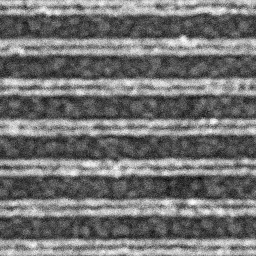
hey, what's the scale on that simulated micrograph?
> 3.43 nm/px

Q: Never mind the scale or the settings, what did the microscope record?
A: parallel lines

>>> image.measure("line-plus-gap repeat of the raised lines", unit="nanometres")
138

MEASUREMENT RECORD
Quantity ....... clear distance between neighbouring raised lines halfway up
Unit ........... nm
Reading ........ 92.6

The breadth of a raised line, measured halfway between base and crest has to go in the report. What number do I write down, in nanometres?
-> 44.6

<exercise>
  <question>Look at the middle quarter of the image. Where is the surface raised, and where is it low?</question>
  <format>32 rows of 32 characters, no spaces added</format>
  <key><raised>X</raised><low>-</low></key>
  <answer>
--------------------------------
--------------------------------
--------------------------------
--------------------------------
XXXXXXXXXXXXXXXXXXXXXXXXXXXXXXXX
XXXXXXXXXXXXXXXXXXXXXXXXXXXXXXXX
XXXXXXXXXXXXXXXXXXXXXXXXXXXXXXXX
--------------------------------
--------------------------------
--------------------------------
--------------------------------
--------------------------------
--------------------------------
--------------------------------
XXXXXXXXXXXXXXXXXXXXX---XXXXXXXX
XXXXXXXXXXXXXXXXXXXXXXXXXXXXXXXX
XXXXXXXXXXXXXXXXXXXXXXXXXXXXXXXX
--------------------------------
--------------------------------
--------------------------------
--------------------------------
--------------------------------
--------------------------------
--------------------------------
XXXXXXXXXXXXX-XX----XXXXXXXXXXXX
XXXXXXXXXXXXXXXXXXXXXXXXXXXXXXXX
XXXXXXXXXXXXXXXXXXXXXXXXXXXXXXXX
X-----------XX------------------
--------------------------------
--------------------------------
--------------------------------
--------------------------------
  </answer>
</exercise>